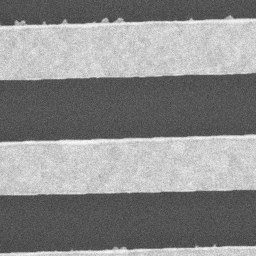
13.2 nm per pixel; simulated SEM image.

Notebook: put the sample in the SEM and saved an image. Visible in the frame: lines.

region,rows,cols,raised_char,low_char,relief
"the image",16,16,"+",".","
................
.....+++++++++++
++++++++++++++++
++++++++++++++++
++++++++++++++++
................
................
................
................
++++++++++++++++
++++++++++++++++
++++++++++++++++
................
................
................
............++++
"